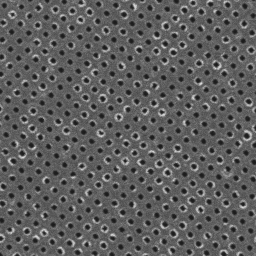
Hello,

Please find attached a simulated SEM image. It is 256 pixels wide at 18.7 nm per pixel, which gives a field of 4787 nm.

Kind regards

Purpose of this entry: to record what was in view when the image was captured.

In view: a regular array of holes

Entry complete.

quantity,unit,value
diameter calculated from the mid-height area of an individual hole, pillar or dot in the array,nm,110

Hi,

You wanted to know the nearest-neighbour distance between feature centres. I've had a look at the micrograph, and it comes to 11.8 pixels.